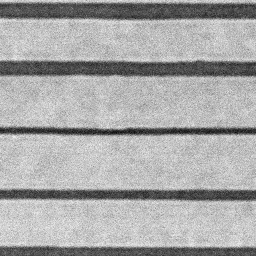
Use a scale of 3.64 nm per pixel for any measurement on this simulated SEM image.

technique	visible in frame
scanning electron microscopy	one or a few lines or trenches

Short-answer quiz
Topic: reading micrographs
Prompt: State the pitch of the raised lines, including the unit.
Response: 0.222 µm